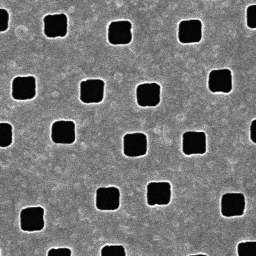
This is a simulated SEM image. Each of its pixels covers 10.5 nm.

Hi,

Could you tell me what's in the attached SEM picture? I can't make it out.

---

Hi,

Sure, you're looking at a regular array of holes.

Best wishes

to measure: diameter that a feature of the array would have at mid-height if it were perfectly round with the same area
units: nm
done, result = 269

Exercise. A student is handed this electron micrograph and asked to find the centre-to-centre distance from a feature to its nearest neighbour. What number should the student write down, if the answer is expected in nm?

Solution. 616